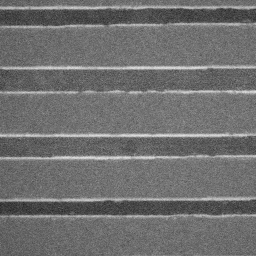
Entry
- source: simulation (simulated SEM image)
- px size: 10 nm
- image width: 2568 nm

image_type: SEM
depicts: lines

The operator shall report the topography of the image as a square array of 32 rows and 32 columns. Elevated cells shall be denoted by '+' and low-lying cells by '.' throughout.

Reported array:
++++++++++++++++++++++++++++++++
................................
................................
++++++++++++++++++++++++++++++++
++++++++++++++++++++++++++++++++
++++++++++++++++++++++++++++++++
++++++++++++++++++++++++++++++++
++++++++++++++++++++++++++++++++
+++++++++++++++++++++++++.......
................................
................................
.........................++++...
++++++++++++++++++++++++++++++++
++++++++++++++++++++++++++++++++
++++++++++++++++++++++++++++++++
++++++++++++++++++++++++++++++++
++++++++++++++++++++++++++++++++
................................
................................
................................
++++++++++++++++++++++++++++++++
++++++++++++++++++++++++++++++++
++++++++++++++++++++++++++++++++
++++++++++++++++++++++++++++++++
++++++++++++++++++++++++++++++++
................................
................................
++++++++++++++++++++++++++++++++
++++++++++++++++++++++++++++++++
++++++++++++++++++++++++++++++++
++++++++++++++++++++++++++++++++
++++++++++++++++++++++++++++++++